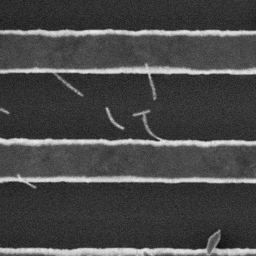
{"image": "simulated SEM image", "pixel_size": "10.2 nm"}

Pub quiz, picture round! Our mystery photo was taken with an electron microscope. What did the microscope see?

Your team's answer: lines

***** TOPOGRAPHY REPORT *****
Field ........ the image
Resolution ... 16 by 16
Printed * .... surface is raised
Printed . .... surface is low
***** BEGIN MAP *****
................
................
****************
****************
**.*****.*******
................
................
................
................
****************
****************
................
................
................
................
.............*..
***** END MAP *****